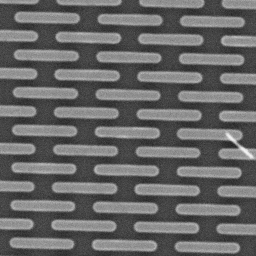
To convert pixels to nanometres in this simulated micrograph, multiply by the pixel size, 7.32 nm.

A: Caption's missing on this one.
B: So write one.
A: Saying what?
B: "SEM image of groups of lines, slits or small figures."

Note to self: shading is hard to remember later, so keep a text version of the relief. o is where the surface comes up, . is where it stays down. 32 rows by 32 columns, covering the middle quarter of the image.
................................
................................
oooooooooooooo.....ooooooooooooo
oooooooooooooo.....ooooooooooooo
...........................ooooo
................................
ooo......oooo...................
ooo.....oooooooooooooooo.....ooo
.........ooooooooooooooo.....ooo
................................
................................
ooooooooooooo......oooo.........
ooooooooooooo.....oooooooooooooo
...................ooooooooooooo
................................
................................
ooo.....ooooooooooooooo......ooo
ooo.....oooooooooooooooo.....ooo
....................ooo......ooo
................................
oooo............................
ooooooooooooo.....oooooooooooooo
ooooooooooooo.....oooooooooooooo
................................
................................
ooo.....oooooooooo..............
ooo.....ooooooooooooooo......ooo
..........ooooooooooooo......ooo
................................
................................
ooooooooooooo.....oooooooooooo..
ooooooooooooo.....oooooooooooooo